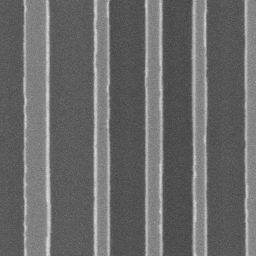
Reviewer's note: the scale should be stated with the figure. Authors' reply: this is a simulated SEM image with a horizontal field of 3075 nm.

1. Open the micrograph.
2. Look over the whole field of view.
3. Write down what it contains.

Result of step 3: lines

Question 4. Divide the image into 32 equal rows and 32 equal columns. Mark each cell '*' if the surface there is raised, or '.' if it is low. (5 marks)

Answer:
...***......**....**....**.....*
...***......**....**....**.....*
...***......**....**....**.....*
...***......**....**....**.....*
...***......**....**....**.....*
...***......**....**....**.....*
...***......**....**....**.....*
...***......**....**....**.....*
...***......**....**....**.....*
...***......**....**....**.....*
...***......**....**....**.....*
...***......**....**....**.....*
...***......**....**....**.....*
...***......**....**....**.....*
...***......**....**....**.....*
...***......**....**....**.....*
...***......**....**....**.....*
...***......**....**....**.....*
...***......**....**....**.....*
...***......**....**....**.....*
...***......**....**....**.....*
...***......**....**....**.....*
...***......**....**....**.....*
...***......**....**....**.....*
...***......**....**....**.....*
...***......**....**....**.....*
...***......**....**....**.....*
...***......**....**....**.....*
...***......**....**....**.....*
...***......**....**....**.....*
...***......**....**....**.....*
...***......**....**....**.....*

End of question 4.